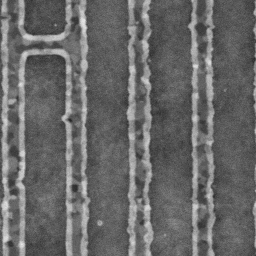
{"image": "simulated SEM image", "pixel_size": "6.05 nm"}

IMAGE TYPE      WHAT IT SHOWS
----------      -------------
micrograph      one or a few lines or trenches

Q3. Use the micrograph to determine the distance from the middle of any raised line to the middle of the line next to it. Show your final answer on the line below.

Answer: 0.381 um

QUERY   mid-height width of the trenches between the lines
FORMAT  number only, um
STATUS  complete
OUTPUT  0.28